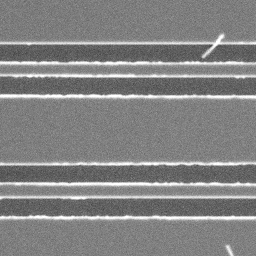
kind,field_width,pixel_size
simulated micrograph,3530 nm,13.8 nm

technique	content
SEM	lines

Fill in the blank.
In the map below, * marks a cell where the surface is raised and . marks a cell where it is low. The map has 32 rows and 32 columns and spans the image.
********************************
********************************
********************************
********************************
********************************
...*......................**....
................................
................................
********************************
...***.*************************
................................
................................
********************************
********************************
********************************
********************************
********************************
********************************
********************************
********************************
*******************************.
................................
................................
********************************
********************************
................................
................................
********************************
********************************
********************************
********************************
********************************